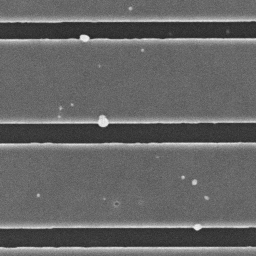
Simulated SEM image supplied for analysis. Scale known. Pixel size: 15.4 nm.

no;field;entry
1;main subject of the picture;lines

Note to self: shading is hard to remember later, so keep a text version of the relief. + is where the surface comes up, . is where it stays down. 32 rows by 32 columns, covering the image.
++++++++++++++++++++++++++++++++
++++++++++++++++++++++++++++++++
++++++++++++++++++++++++++++++++
................................
..........+.....................
++++++++++++++++++++++++++++++++
++++++++++++++++++++++++++++++++
++++++++++++++++++++++++++++++++
++++++++++++++++++++++++++++++++
++++++++++++++++++++++++++++++++
++++++++++++++++++++++++++++++++
++++++++++++++++++++++++++++++++
++++++++++++++++++++++++++++++++
++++++++++++++++++++++++++++++++
++++++++++++++++++++++++++++++++
............++..................
................................
................................
++++++++++++++++++++++++++++++++
++++++++++++++++++++++++++++++++
++++++++++++++++++++++++++++++++
++++++++++++++++++++++++++++++++
++++++++++++++++++++++++++++++++
++++++++++++++++++++++++++++++++
++++++++++++++++++++++++++++++++
++++++++++++++++++++++++++++++++
++++++++++++++++++++++++++++++++
++++++++++++++++++++++++++++++++
+++++++.................++......
................................
................................
++++++++++++++++++++++++++++++++